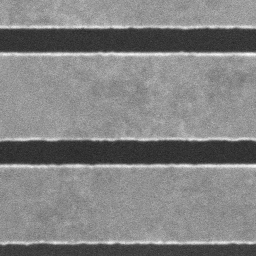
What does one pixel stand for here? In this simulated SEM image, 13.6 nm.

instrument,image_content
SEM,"lines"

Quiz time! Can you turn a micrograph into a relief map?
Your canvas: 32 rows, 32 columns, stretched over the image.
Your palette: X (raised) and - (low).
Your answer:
XXXXXXXXXXXXXXXXXXXXXXXXXXXXXXXX
XXXXXXXXXXXXXXXXXXXXXXXXXXXXXXXX
XXXXXXXXXXXXXXXXXXXXXXXXXXXXXXXX
----------------------XX--------
--------------------------------
--------------------------------
--------------------------------
XXXXXXXXXXXXXXXXXXXXXXXXXXXXXXXX
XXXXXXXXXXXXXXXXXXXXXXXXXXXXXXXX
XXXXXXXXXXXXXXXXXXXXXXXXXXXXXXXX
XXXXXXXXXXXXXXXXXXXXXXXXXXXXXXXX
XXXXXXXXXXXXXXXXXXXXXXXXXXXXXXXX
XXXXXXXXXXXXXXXXXXXXXXXXXXXXXXXX
XXXXXXXXXXXXXXXXXXXXXXXXXXXXXXXX
XXXXXXXXXXXXXXXXXXXXXXXXXXXXXXXX
XXXXXXXXXXXXXXXXXXXXXXXXXXXXXXXX
XXXXXXXXXXXXXXXXXXXXXXXXXXXXXXXX
XXXX-XXX---XXXX--XXX--XXXX--XX-X
--------------------------------
--------------------------------
--------------------------------
XXXXXXXXXXXXXXXXXXXXXXXXXXXXXXXX
XXXXXXXXXXXXXXXXXXXXXXXXXXXXXXXX
XXXXXXXXXXXXXXXXXXXXXXXXXXXXXXXX
XXXXXXXXXXXXXXXXXXXXXXXXXXXXXXXX
XXXXXXXXXXXXXXXXXXXXXXXXXXXXXXXX
XXXXXXXXXXXXXXXXXXXXXXXXXXXXXXXX
XXXXXXXXXXXXXXXXXXXXXXXXXXXXXXXX
XXXXXXXXXXXXXXXXXXXXXXXXXXXXXXXX
XXXXXXXXXXXXXXXXXXXXXXXXXXXXXXXX
X--X----------------------------
--------------------------------